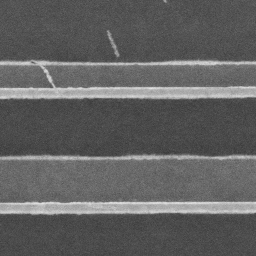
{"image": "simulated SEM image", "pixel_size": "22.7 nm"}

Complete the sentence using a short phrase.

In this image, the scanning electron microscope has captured lines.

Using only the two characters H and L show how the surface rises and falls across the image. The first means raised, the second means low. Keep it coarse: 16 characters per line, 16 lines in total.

LLLLLLLLLLLLLLLL
LLLLLLLLLLLLLLLL
LLLLLLLLLLLLLLLL
LLLLLLLLLLLLLLLL
HHHHHHHHHHHHHHHH
HHHHHHHHHHHHHHHH
LLLLLLLLLLLLLLLL
LLLLLLLLLLLLLLLL
LLLLLLLLLLLLLLLL
LLLLLLLLLLLLLLLL
HHHHHHHHHHHHHHHH
HHHHHHHHHHHHHHHH
HHHHHHHHHHHHHHHH
LLLLLLLLLLLLLLLL
LLLLLLLLLLLLLLLL
LLLLLLLLLLLLLLLL